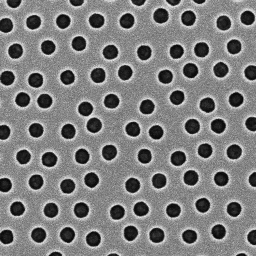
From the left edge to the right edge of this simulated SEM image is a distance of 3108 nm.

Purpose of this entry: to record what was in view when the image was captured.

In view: a regular array of holes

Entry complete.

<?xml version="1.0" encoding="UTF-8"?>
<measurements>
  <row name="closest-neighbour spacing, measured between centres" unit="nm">319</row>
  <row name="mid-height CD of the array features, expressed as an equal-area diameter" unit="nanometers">186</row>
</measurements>